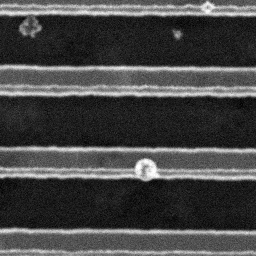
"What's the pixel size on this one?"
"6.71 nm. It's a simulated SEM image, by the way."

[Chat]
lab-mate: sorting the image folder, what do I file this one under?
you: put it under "lines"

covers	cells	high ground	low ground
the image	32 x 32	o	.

oooooooooooooooooooooooooooooooo
oooooooooooooooooooooooooooooooo
................................
................................
................................
................................
................................
................................
ooo.............................
oooooooooooooooooooooooooooooooo
oooooooooooooooooooooooooooooooo
oooooooooooooooooooooooooooooooo
................................
................................
................................
................................
................................
................................
................................
oooooooooooooooooooooooooooooooo
oooooooooooooooooooooooooooooooo
oooooooooooooooooooooooooooooooo
..................o.............
................................
................................
................................
................................
................................
................................
oooooooooooooooooooooooooooooooo
oooooooooooooooooooooooooooooooo
oooooooooooooooooooooooooooooooo